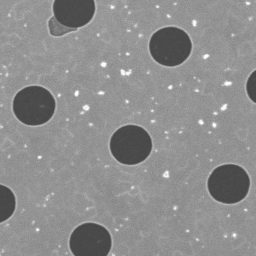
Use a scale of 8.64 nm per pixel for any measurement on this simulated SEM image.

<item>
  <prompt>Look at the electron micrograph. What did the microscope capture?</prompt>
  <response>holes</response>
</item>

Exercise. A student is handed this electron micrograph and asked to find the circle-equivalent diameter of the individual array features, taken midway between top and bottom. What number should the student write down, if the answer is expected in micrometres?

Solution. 0.355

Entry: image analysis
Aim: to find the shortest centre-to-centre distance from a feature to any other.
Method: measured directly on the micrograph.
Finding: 908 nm